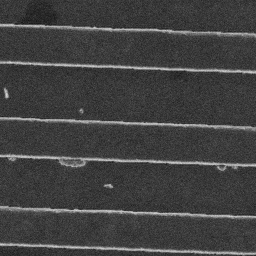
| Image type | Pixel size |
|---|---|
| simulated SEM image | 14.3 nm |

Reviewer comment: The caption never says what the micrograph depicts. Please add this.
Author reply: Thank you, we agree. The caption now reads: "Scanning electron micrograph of lines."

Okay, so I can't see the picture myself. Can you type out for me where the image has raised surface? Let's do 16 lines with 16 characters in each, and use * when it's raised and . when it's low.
................
................
****************
****************
................
................
................
***.............
****************
****************
................
................
................
**************..
****************
.....***********